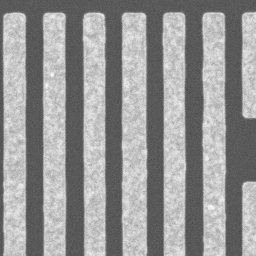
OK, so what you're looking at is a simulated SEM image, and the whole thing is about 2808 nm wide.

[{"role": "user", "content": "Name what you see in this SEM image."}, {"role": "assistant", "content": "wiring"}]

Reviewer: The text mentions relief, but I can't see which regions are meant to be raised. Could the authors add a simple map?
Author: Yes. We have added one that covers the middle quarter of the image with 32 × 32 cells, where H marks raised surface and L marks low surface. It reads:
LLLLLHHHHHLLLLLHHHHHLLLLLHHHHHLL
LLLLLHHHHHLLLLLHHHHHLLLLLHHHHHLL
LLLLLHHHHHLLLLLHHHHHLLLLLHHHHHLL
LLLLLHHHHHLLLLLHHHHHLLLLLHHHHHLL
LLLLLHHHHHLLLLLHHHHHLLLLLHHHHHLL
LLLLLHHHHHLLLLLHHHHHLLLLLHHHHHLL
LLLLLHHHHHLLLLLHHHHHLLLLLHHHHHLL
LLLLLHHHHHLLLLLHHHHHLLLLLHHHHHLL
LLLLLHHHHHLLLLLHHHHHLLLLLHHHHHLL
LLLLLHHHHHLLLLLHHHHHLLLLLHHHHHLL
LLLLLHHHHHLLLLLHHHHHLLLLLHHHHHLL
LLLLLHHHHHLLLLLHHHHHLLLLLHHHHHLL
LLLLLHHHHHLLLLLHHHHHLLLLLHHHHHLL
LLLLLHHHHHLLLLLHHHHHLLLLLHHHHHLL
LLLLLHHHHHLLLLLHHHHHLLLLLHHHHHLL
LLLLLHHHHHLLLLLHHHHHLLLLLHHHHHLL
LLLLLHHHHHLLLLLHHHHHLLLLLHHHHHLL
LLLLLHHHHHLLLLLHHHHHLLLLLHHHHHLL
LLLLLHHHHHLLLLLHHHHHLLLLLHHHHHLL
LLLLLHHHHHLLLLLHHHHHLLLLLHHHHHLL
LLLLLHHHHHLLLLLHHHHHLLLLLHHHHHLL
LLLLLHHHHHLLLLLHHHHHHLLLLHHHHHLL
LLLLLHHHHHLLLLLHHHHHHLLLLHHHHHLL
LLLLLHHHHHLLLLLHHHHHHLLLLHHHHHLL
LLLLLHHHHHLLLLLHHHHHLLLLLHHHHHLL
LLLLLHHHHHLLLLLHHHHHLLLLLHHHHHLL
LLLLLHHHHHLLLLLHHHHHHLLLLHHHHHLL
LLLLLHHHHHLLLLLHHHHHHLLLLHHHHHLL
LLLLLHHHHHLLLLLHHHHHHLLLLHHHHHLL
LLLLLHHHHHLLLLLHHHHHHLLLLHHHHHLL
LLLLLHHHHHLLLLLHHHHHHLLLLHHHHHLL
LLLLLHHHHHLLLLLHHHHHHLLLLHHHHHLL